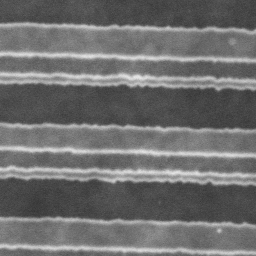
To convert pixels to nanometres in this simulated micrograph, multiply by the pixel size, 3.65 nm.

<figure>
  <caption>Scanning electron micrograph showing lines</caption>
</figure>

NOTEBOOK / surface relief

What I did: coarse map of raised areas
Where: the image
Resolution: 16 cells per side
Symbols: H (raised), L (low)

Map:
LLLLLLLLLLLLLLLL
LHLLLLLLLLLLLLLL
HHHHHHHHHHHHHHHH
HHHHHHHHHHHHHHHH
HHHHHHHHHHHHHHHH
LLLLLLLLLLLLLHHH
LLLLLLLLLLLLLLLL
LLLLLLLLLLLLLLLL
HHHHHHHHHHHHHHHH
HHHHHHHHHHHHHHHH
HHHHHHHHHHHHHHHH
LLLLLLLLLLLLLLLH
LLLLLLLLLLLLLLLL
LLLLLLLLLLLLLLLL
HHHHHHHHHHHHHHHH
HHHHHHHHHHHHHHHH